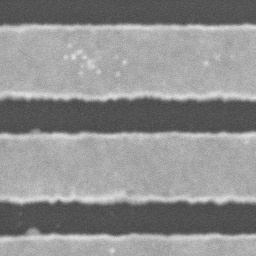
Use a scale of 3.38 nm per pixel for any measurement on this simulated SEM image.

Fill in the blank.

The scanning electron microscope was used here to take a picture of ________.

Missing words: lines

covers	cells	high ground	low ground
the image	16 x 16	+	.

................
................
++++++++++++++++
++++++++++++++++
++++++++++++++++
++++++++++++++++
................
................
++++++++++++++++
++++++++++++++++
++++++++++++++++
++++++++++++++++
++++++++++++++++
................
................
++++++++++++++++